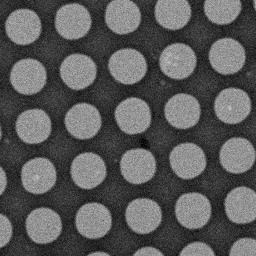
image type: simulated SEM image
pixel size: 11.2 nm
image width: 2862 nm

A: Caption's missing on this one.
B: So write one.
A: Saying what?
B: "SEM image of an array of small figures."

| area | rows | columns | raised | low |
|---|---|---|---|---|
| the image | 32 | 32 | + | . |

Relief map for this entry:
..............+++...++++..++++..
..++...++++..++++..+++++..++++..
.++++..++++..++++...++++..+++...
.++++..++++...+++....++.........
.++++...++......................
..+...................+....+++..
...............++...++++..+++++.
...+....+++...++++..++++..+++++.
..+++...++++..++++..++++...+++..
.+++++..++++..++++...++.........
..++++..+++.....................
..+++.......................++..
................++...++++..++++.
.........+++...++++..++++..++++.
..++++..++++..+++++..++++..++++.
..++++..+++++..++++..+++........
..++++...+++....++..............
...+++.......................++.
......................+++...++++
..........++...++++..+++++..++++
...+++...++++..++++..+++++..++++
...++++..++++..++++...+++....+..
+..++++..++++...+++.............
+..+++....+...................+.
.......................++...++++
...........+....++++..++++..++++
....+++...++++..++++..++++..++++
+..+++++..++++..++++..++++...+++
+..+++++..++++..+++.....+.......
+...+++....++...................
+.......................++...+++
.................+++...++++..+++